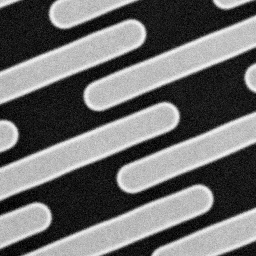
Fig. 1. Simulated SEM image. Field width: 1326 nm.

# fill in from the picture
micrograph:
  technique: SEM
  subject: groups of lines, slits or small figures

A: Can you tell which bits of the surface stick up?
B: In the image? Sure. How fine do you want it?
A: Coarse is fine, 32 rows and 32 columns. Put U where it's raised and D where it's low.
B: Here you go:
UDDDDDDUUUUUUUUUDDDDDDDDDDDUUUDD
DDDDDDUUUUUUUDDDDDDDDDDDDDDDDDDD
DDDDDDDUUUUDDDDDDDDDDDDDDDDDDDDU
DDDDDDDDDDDDDDUUUUDDDDDDDDDDDUUU
DDDDDDDDDDDUUUUUUUDDDDDDDDUUUUUU
DDDDDDDDDUUUUUUUUUDDDDDDUUUUUUUU
DDDDDDUUUUUUUUUUDDDDDUUUUUUUUUDD
DDDDUUUUUUUUUDDDDDDUUUUUUUUUDDDD
DUUUUUUUUUUDDDDDUUUUUUUUUDDDDDDU
UUUUUUUUDDDDDDUUUUUUUUUDDDDDDDDU
UUUUUUDDDDDDUUUUUUUUDDDDDDDDDDDU
UUUUDDDDDDDUUUUUUUDDDDDDDDDDDDDD
UDDDDDDDDDDUUUUUDDDDDDDDDDDDDDDD
DDDDDDDDDDDDUDDDDDDUUUDDDDDDDDDD
DDDDDDDDDDDDDDDDUUUUUUDDDDDDDDDU
UDDDDDDDDDDDDDUUUUUUUUDDDDDDUUUU
UUDDDDDDDDDUUUUUUUUUUDDDDDUUUUUU
UUDDDDDDDUUUUUUUUUDDDDDDUUUUUUUU
UDDDDDUUUUUUUUUUDDDDDUUUUUUUUUDD
DDDDUUUUUUUUUDDDDDDUUUUUUUUUDDDD
DDUUUUUUUUUDDDDDUUUUUUUUUDDDDDDD
UUUUUUUUDDDDDDDUUUUUUUUDDDDDDDDD
UUUUUUDDDDDDDDDUUUUUUDDDDDDDDDDD
UUUUDDDDDDDDDDDUUUDDDDDDUUDDDDDD
UDDDDDDDDDDDDDDDDDDDDUUUUUDDDDDD
DDDDDDDDDDDDDDDDDDDUUUUUUUDDDDDD
DDUUUUDDDDDDDDDDUUUUUUUUUDDDDDDU
UUUUUUDDDDDDDDUUUUUUUUUDDDDDUUUU
UUUUUUDDDDDUUUUUUUUUUDDDDDUUUUUU
UUUUDDDDDUUUUUUUUUDDDDDDUUUUUUUU
UDDDDDDUUUUUUUUUDDDDDUUUUUUUUUUD
DDDDUUUUUUUUUDDDDDDUUUUUUUUUDDDD